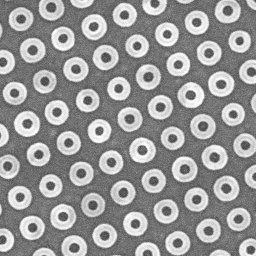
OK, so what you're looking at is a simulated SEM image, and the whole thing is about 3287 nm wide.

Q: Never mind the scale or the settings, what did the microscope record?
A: a regular array of ring-shaped raised bodies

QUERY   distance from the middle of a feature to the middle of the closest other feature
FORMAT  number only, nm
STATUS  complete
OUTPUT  414